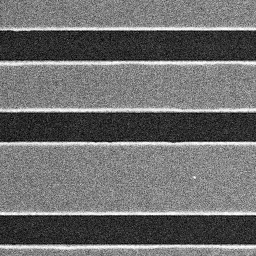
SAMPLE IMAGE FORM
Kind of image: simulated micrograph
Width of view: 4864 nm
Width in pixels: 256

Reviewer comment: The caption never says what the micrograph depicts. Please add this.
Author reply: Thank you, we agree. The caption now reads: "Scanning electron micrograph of lines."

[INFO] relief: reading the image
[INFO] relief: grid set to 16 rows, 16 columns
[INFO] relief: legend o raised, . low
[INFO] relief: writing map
oooooooooooooooo
oooooooooooooooo
................
................
oooooooooooooooo
oooooooooooooooo
oooooooooooooooo
................
................
oooooooooooooooo
oooooooooooooooo
oooooooooooooooo
oooooooooooooooo
................
................
oooooooooooooooo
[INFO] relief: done